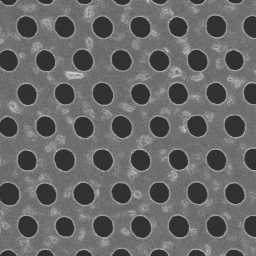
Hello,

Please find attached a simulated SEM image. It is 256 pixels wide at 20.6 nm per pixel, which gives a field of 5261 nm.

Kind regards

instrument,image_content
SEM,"a regular array of holes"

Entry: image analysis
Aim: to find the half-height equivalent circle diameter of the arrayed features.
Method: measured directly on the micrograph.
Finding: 0.419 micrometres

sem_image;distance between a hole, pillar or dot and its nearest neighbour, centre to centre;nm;769